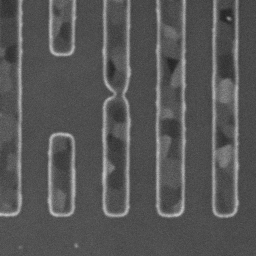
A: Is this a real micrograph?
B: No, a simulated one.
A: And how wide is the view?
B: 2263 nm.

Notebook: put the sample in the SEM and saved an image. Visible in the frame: wiring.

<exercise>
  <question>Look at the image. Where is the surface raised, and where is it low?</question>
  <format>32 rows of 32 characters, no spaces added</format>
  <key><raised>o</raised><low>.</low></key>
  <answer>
ooo...ooo....ooo....ooo....ooo..
ooo...ooo....ooo....ooo....ooo..
ooo...ooo....ooo....ooo....ooo..
ooo...ooo....ooo....ooo....ooo..
ooo...ooo....ooo....ooo....ooo..
ooo...ooo....ooo....ooo....ooo..
ooo....oo....ooo....ooo....ooo..
ooo..........ooo....ooo....ooo..
ooo..........ooo....ooo....ooo..
ooo..........ooo....ooo....ooo..
ooo..........ooo....ooo....ooo..
ooo...........oo....ooo....ooo..
ooo..........ooo....ooo....ooo..
ooo..........ooo....ooo....ooo..
ooo..........ooo....ooo....ooo..
ooo..........ooo....ooo....ooo..
ooo..........ooo....ooo....ooo..
ooo...ooo....ooo....ooo....ooo..
ooo...ooo....ooo....ooo....ooo..
ooo...ooo....ooo....ooo....ooo..
ooo...ooo....ooo....ooo....ooo..
ooo...ooo....ooo....ooo....ooo..
ooo...ooo....ooo....ooo....ooo..
ooo...ooo....ooo....ooo....ooo..
oo....ooo....ooo....ooo....ooo..
oo....ooo....ooo....ooo....ooo..
oo....ooo....ooo....ooo....oo...
................................
................................
................................
................................
................................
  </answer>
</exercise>